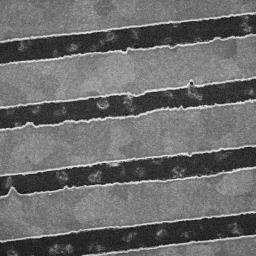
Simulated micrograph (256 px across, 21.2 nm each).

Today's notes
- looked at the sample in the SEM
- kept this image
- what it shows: one or a few lines or trenches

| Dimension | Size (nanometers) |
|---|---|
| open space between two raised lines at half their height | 480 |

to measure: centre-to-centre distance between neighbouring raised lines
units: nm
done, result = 1400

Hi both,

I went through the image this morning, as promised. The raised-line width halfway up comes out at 918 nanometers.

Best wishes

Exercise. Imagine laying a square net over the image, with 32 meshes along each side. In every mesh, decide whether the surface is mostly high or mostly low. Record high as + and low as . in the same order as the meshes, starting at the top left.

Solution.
++++++++++++++++++++++++++++++++
++++++++++++++++++++++++++++++++
++++++++++++++++++++++++........
+++++++++++++++.................
++++++.........................+
........................++++++++
..............++++++++++++++++++
......++++++++++++++++++++++++++
++++++++++++++++++++++++++++++++
++++++++++++++++++++++++++++++++
++++++++++++++++++++++++++......
++++++++++++++++++..............
+++++++++.......................
........................++++++++
.................+++++++++++++++
.......+++++++++++++++++++++++++
++++++++++++++++++++++++++++++++
++++++++++++++++++++++++++++++++
++++++++++++++++++++++++++++++..
+++++++++++++++++++++...........
++++++++++++....................
++++.........................+++
.....................+++++++++++
........++++++++++++++++++++++++
.+++++++++++++++++++++++++++++++
++++++++++++++++++++++++++++++++
++++++++++++++++++++++++++++++++
+++++++++++++++++++++++.........
+++++++++++++...................
+++++..........................+
.......................+++++++++
...............+++++++++++++++++